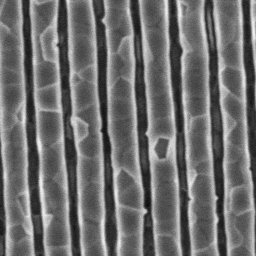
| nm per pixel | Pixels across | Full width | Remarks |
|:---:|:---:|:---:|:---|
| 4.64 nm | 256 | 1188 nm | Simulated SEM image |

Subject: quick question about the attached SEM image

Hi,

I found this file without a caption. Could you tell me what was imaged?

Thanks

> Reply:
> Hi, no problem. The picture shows parallel lines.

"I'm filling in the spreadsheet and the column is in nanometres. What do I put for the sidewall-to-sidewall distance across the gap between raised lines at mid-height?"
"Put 46.9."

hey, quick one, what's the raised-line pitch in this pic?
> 0.171 µm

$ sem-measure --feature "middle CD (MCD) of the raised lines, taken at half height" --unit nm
123